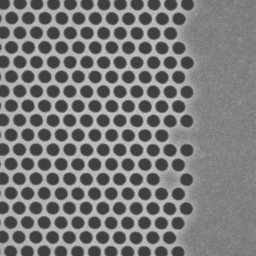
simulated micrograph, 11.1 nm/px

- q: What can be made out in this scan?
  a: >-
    a regular array of holes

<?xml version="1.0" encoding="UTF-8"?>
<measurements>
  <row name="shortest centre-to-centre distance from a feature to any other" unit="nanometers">184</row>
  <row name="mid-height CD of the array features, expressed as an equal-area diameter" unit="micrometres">0.148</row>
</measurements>